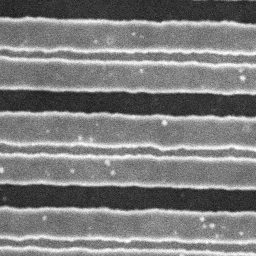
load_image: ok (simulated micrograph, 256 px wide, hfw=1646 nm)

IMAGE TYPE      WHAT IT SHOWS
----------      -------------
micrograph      lines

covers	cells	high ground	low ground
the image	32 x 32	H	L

LLLLLLLLLLLLLLLLLLLLLLLLLLLLLLLL
LLLLLLLLLLLLLLLLLLLLLLLLLLLLLLLL
HHHHHHHHLLLLLLLLLLLLLLLLLLLLLLLL
HHHHHHHHHHHHHHHHHHHHHHHHHHHHHHHH
HHHHHHHHHHHHHHHHHHHHHHHHHHHHHHHH
HHHHHHHHHHHHHHHHHHHHHHHHHHHHHHHH
HHHHHHHHHHHHHHHHHHHHHHHHHHHHHHHH
HHHHHHHHHHHHHHHHHHHHHHHHHHHHHHHH
HHHHHHHHHHHHHHHHHHHHHHHHHHHHHHHH
HHHHHHHHHHHHHHHHHHHHHHHHHHHHHHHH
HHHHHHHHHHHHHHHHHHHHHHHHHHHHHHHH
LLLLLLLLLLLLLLLLHLHHHHHHHHHHHHHH
LLLLLLLLLLLLLLLLLLLLLLLLLLLLLLLL
LLLLLLLLLLLLLLLLLLLLLLLLLLLLLLLL
HHHHHHHHHHHHHHHHHLLHHLLLLLLLLLLL
HHHHHHHHHHHHHHHHHHHHHHHHHHHHHHHH
HHHHHHHHHHHHHHHHHHHHHHHHHHHHHHHH
HHHHHHHHHHHHHHHHHHHHHHHHHHHHHHHH
HHHHHHHHHHHHHHHHHHHHHHHHHHHHHHHH
HHHHHHHHHHHHHHHHHHHHHHHHHHHHHHHH
HHHHHHHHHHHHHHHHHHHHHHHHHHHHHHHH
HHHHHHHHHHHHHHHHHHHHHHHHHHHHHHHH
HHHHHHHHHHHHHHHHHHHHHHHHHHHHHHHH
LLLLLLLLLLLLLLLLLLLLLLLLHHHHHHHH
LLLLLLLLLLLLLLLLLLLLLLLLLLLLLLLL
LLLLLLLLLLLLLLLLLLLLLLLLLLLLLLLL
HHHHHHHHHHHHHHHHHHHHHHHHHLLLLLLL
HHHHHHHHHHHHHHHHHHHHHHHHHHHHHHHH
HHHHHHHHHHHHHHHHHHHHHHHHHHHHHHHH
HHHHHHHHHHHHHHHHHHHHHHHHHHHHHHHH
HHHHHHHHHHHHHHHHHHHHHHHHHHHHHHHH
HHHHHHHHHHHHHHHHHHHHHHHHHHHHHHHH